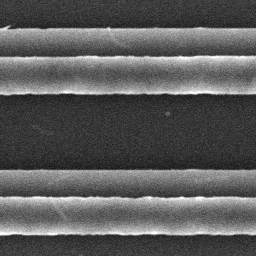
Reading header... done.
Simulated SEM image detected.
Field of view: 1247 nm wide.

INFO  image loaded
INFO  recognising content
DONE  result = lines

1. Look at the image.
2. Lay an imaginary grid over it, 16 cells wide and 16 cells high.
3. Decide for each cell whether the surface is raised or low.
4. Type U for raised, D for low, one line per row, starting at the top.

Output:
DDDDDDDDDDDDDDDD
DDDDDDDDDDDDDDDD
UUUUUUUUUUUUUUUU
UUUUUUUUUUUUUUUU
UUUUUUUUUUUUUUUU
UUUUUUUUUUUUUUUU
DDDDDDDDDDDDDDDD
DDDDDDDDDDDDDDDD
DDDDDDDDDDDDDDDD
DDDDDDDDDDDDDDDD
DDDDDDDDDDDDDDDD
UUUUUUUUUUUUUUUU
UUUUUUUUUUUUUUUU
UUUUUUUUUUUUUUUU
UUUUUUUUUUUUUUUU
DDDDDDDDDDDDDDDD